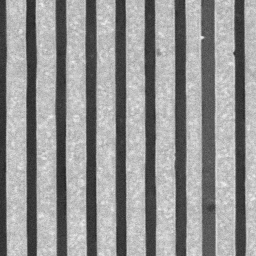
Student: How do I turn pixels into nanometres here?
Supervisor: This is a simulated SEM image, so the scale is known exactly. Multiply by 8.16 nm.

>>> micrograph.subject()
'parallel lines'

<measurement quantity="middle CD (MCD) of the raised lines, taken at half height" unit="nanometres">159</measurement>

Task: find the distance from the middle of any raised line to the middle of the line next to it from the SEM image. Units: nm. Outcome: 243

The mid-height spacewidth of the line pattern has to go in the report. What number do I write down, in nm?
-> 86.7